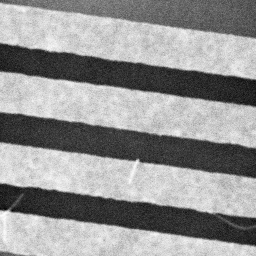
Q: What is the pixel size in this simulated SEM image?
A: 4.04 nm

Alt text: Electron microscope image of lines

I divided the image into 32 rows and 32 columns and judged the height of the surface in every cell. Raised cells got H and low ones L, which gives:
LLLLLLLLLLLLLLLLLLLLLLLLLLLLLLLL
HHHHHHHHLLLLLLLLLLLLLLLLLLLLLLLL
HHHHHHHHHHHHHHHLLLLLLLLLLLLLLLLL
HHHHHHHHHHHHHHHHHHHHHHLLLLLLLLLL
HHHHHHHHHHHHHHHHHHHHHHHHHHHHHLLL
LHHHHHHHHHHHHHHHHHHHHHHHHHHHHHHH
LLLLLLLHHHHHHHHHHHHHHHHHHHHHHHHH
LLLLLLLLLLLLLLHHHHHHHHHHHHHHHHHH
LLLLLLLLLLLLLLLLLLLLLLHHHHHHHHHH
HHHHLLLLLLLLLLLLLLLLLLLLLLLLLHHH
HHHHHHHHHHHLLLLLLLLLLLLLLLLLLLLL
HHHHHHHHHHHHHHHHHHLLLLLLLLLLLLLL
HHHHHHHHHHHHHHHHHHHHHHHHHHLLLLLL
HHHHHHHHHHHHHHHHHHHHHHHHHHHHHHHH
LLLLHHHHHHHHHHHHHHHHHHHHHHHHHHHH
LLLLLLLLLLLHHHHHHHHHHHHHHHHHHHHH
LLLLLLLLLLLLLLLLLLHHHHHHHHHHHHHH
LLLLLLLLLLLLLLLLLLLLLLLLLLHHHHHH
HHHHHLLLLLLLLLLLLLLLLLLLLLLLLLLL
HHHHHHHHHHHHLLLLLLLLLLLLLLLLLLLL
HHHHHHHHHHHHHHHHHHHLLLLLLLLLLLLL
HHHHHHHHHHHHHHHHHHHHHHHHHHLLLLLL
HHHHHHHHHHHHHHHHHHHHHHHHHHHHHHHH
LLLLLHHHHHHHHHHHHHHHHHHHHHHHHHHH
LLLLLLLLLLLLHHHHHHHHHHHHHHHHHHHH
LLLLLLLLLLLLLLLLLLLHHHHHHHHHHHHH
HLLLLLLLLLLLLLLLLLLLLLLLLLHHHHHH
HHHHHHHHHLLLLLLLLLLLLLLLLLLLLLLL
HHHHHHHHHHHHHHHHLLLLLLLLLLLLLLLL
HHHHHHHHHHHHHHHHHHHHHHLLLLLLLLLL
HHHHHHHHHHHHHHHHHHHHHHHHHHHHHHLL
LLHHHHHHHHHHHHHHHHHHHHHHHHHHHHHH